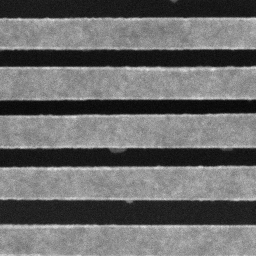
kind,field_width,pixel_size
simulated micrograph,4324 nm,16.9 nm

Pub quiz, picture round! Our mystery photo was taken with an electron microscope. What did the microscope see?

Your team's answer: lines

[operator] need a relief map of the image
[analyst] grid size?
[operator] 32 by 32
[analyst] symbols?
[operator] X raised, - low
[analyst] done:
--------------------------------
--------------------------------
XXXXXXXXXXXXXXXXXXXXXXXXXXXXXXXX
XXXXXXXXXXXXXXXXXXXXXXXXXXXXXXXX
XXXXXXXXXXXXXXXXXXXXXXXXXXXXXXXX
XXXXXXXXXXXXXXXXXXXXXXXXXXXXXXXX
--------------------------------
--------------------------------
XXXXXXXXXXXXXXXXXXXXXXXXXXXXXXXX
XXXXXXXXXXXXXXXXXXXXXXXXXXXXXXXX
XXXXXXXXXXXXXXXXXXXXXXXXXXXXXXXX
XXXXXXXXXXXXXXXXXXXXXXXXXXXXXXXX
--------------------------------
--------------------------------
XXXXXXXXXXXXXXXXXXXXXXXXXXXXXXXX
XXXXXXXXXXXXXXXXXXXXXXXXXXXXXXXX
XXXXXXXXXXXXXXXXXXXXXXXXXXXXXXXX
XXXXXXXXXXXXXXXXXXXXXXXXXXXXXXXX
XXXXXXXX-X-X--XX----X-----------
--------------------------------
--------------------------------
XXXXXXXXXXXXXXXXXXXXXXXXXXXXXXXX
XXXXXXXXXXXXXXXXXXXXXXXXXXXXXXXX
XXXXXXXXXXXXXXXXXXXXXXXXXXXXXXXX
XXXXXXXXXXXXXXXXXXXXXXXXXXXXXXXX
--------------------------------
--------------------------------
--------------------------------
XXXXXXXXXXXXXXXXXXXXXXXXXXXXXXXX
XXXXXXXXXXXXXXXXXXXXXXXXXXXXXXXX
XXXXXXXXXXXXXXXXXXXXXXXXXXXXXXXX
XXXXXXXXXXXXXXXXXXXXXXXXXXXXXXXX